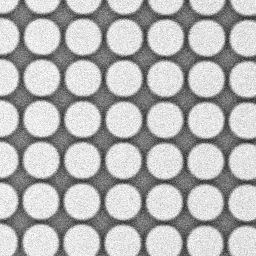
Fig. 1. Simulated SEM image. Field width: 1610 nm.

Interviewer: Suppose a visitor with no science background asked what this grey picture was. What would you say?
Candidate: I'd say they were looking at an array of small figures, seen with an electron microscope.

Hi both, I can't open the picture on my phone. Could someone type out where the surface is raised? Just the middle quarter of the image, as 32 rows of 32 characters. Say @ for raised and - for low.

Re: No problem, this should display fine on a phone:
--@@@@@@----@@@@@@----@@@@@@----
-@@@@@@@@--@@@@@@@@---@@@@@@@---
@@@@@@@@@--@@@@@@@@--@@@@@@@@@-@
@@@@@@@@@--@@@@@@@@--@@@@@@@@@-@
@@@@@@@@@--@@@@@@@@--@@@@@@@@@-@
-@@@@@@@@--@@@@@@@@--@@@@@@@@--@
-@@@@@@@----@@@@@@----@@@@@@@---
---@@@@------@@@@------@@@@@----
--------------------------------
--------------------------------
--@@@@@@----@@@@@@-----@@@@@----
-@@@@@@@---@@@@@@@@---@@@@@@@---
-@@@@@@@@--@@@@@@@@--@@@@@@@@--@
@@@@@@@@@--@@@@@@@@--@@@@@@@@@-@
@@@@@@@@@--@@@@@@@@--@@@@@@@@@-@
-@@@@@@@@--@@@@@@@@--@@@@@@@@--@
-@@@@@@@---@@@@@@@@---@@@@@@@---
--@@@@@-----@@@@@@-----@@@@@----
--------------------------------
--------------------------------
--@@@@@------@@@@------@@@@-----
-@@@@@@@---@@@@@@@----@@@@@@@---
-@@@@@@@@--@@@@@@@@--@@@@@@@@--@
@@@@@@@@@--@@@@@@@@--@@@@@@@@--@
@@@@@@@@@--@@@@@@@@--@@@@@@@@--@
@@@@@@@@@--@@@@@@@@--@@@@@@@@--@
-@@@@@@@---@@@@@@@@--@@@@@@@@---
--@@@@@-----@@@@@@----@@@@@@----
--------------@@--------@@@-----
--------------------------------
---@@@-------@@@@------@@@@-----
-@@@@@@@----@@@@@@----@@@@@@----